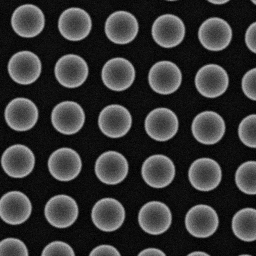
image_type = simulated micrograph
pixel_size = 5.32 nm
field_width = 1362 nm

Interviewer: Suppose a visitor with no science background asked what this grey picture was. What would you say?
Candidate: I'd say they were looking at an array of small figures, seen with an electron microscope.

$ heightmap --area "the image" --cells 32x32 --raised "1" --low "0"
00000000000000000000000000000000
00111000111000110000000000000000
01111101111001111000111000110000
00111001111001111001111001111001
00010000111001111001111001111001
00000000000000000000110001111001
00110000000000000000000000000000
01111001110000110000000000000000
01111001111001111001110001110000
01111001111001111001111011110011
00010000110001110001111011111011
00000000000000000000110001110011
00110000000000000000000000000000
01111001110001110000000000000000
01111011111011110011110001100001
01110001110011110011110011110011
00000000110001110011110011110011
00000000000000000000100001100011
01100000000000000000000000000000
11110011110001100001100000000000
11110011110011110011110011100011
01110011110011110011110011110011
00000001100001100011110011110111
00000000000000000000000011100011
11100001000000000000000000000000
11110011110011100011000000000000
11110011110011110111100011100011
11100011100011110111100111100111
00000000000011100011100111100111
00000000000000000000000011000011
11100011000000000000000000000000
11100111100111100011000010000000